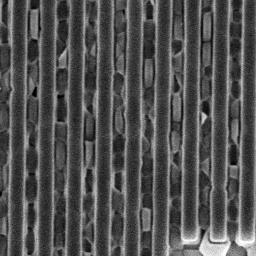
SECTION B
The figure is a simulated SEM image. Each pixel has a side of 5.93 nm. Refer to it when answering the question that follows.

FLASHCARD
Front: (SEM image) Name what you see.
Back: parallel lines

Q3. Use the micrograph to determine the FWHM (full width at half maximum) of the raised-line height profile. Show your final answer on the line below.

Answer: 93.3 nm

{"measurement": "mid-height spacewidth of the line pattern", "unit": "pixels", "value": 13.1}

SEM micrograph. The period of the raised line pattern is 171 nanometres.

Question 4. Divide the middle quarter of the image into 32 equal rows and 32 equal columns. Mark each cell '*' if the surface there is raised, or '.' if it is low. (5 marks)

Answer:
.****...****....***....****...**
.****...****....***.*..****...**
.****...****....*****..****...**
.****...****....***....****...**
.****...****....***....****...**
.****...****....***....****...**
.****...****....***....****...**
.****...****....***....***....**
.****...****....***....***....**
.****...****...****....***..*.**
.****...****...****....***.**.**
.****...****...****....***.**.**
.****...****...****....***..*.**
.****...****...****....***....**
.****...****...****....***....**
.****...****...*****...***....**
.****...****...****....***....**
.****...****...****....***....**
.****...****....***....***....**
.****...****...****....***....**
.****...****...****....***....**
.****...****...****....***....**
.****...****...****....***....**
.****...****...****...****....**
.****...****...****...****....**
.****...****...****...****....**
.****...****...****...****....**
.****...****...****...****....**
.***....****...****...****....**
.***....****...****...****....**
.***....****...****...****....**
.***....****...****...****....**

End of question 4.